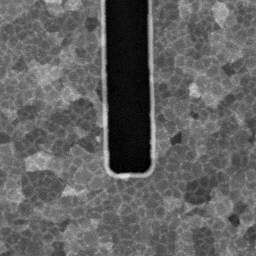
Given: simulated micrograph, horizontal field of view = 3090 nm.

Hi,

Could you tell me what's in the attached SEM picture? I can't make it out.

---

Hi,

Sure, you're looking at one or a few lines or trenches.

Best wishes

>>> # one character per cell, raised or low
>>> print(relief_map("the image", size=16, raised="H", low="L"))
HHHHHHLLLHHHHHHH
HHHHHHLLLHHHHHHH
HHHHHHLLLHHHHHHH
HHHHHHLLLHHHHHHH
HHHHHHLLLLHHHHHH
HHHHHHLLLLHHHHHH
HHHHHHHLLLHHHHHH
HHHHHHHLLLHHHHHH
HHHHHHHLLLHHHHHH
HHHHHHHLLLHHHHHH
HHHHHHHLLHHHHHHH
HHHHHHHHHHHHHHHH
HHHHHHHHHHHHHHHH
HHHHHHHHHHHHHHHH
HHHHHHHHHHHHHHHH
HHHHHHHHHHHHHHHH